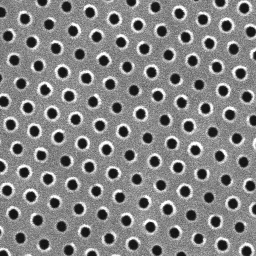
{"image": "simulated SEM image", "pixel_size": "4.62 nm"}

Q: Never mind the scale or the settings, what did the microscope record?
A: a regular array of holes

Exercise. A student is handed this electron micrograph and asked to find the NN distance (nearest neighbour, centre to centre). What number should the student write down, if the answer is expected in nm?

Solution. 112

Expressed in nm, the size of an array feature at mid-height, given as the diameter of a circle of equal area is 45.5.